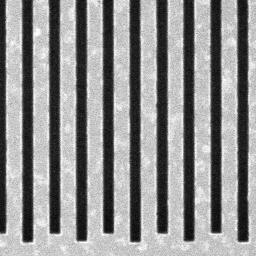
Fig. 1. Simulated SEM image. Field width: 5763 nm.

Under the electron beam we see parallel lines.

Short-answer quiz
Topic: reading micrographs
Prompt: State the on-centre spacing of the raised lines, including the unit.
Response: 606 nanometers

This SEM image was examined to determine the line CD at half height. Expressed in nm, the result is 394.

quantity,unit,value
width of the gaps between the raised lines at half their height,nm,217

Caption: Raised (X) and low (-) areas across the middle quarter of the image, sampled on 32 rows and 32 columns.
XXX---XXXX--XXXX---XXXX---XXXX--
XXX---XXXX--XXXX---XXXX---XXXX--
XXX---XXXX--XXXX---XXXX---XXXX--
XXX---XXXX--XXXX---XXXX---XXXX--
XXX---XXXX--XXXX---XXXX---XXXX--
XXX---XXXX--XXXX---XXXX---XXXX--
XXX---XXXX--XXXX---XXXX---XXXX--
XXX---XXXX--XXXX---XXXX---XXXX--
XXX---XXXX--XXXX---XXXX---XXXX--
XXX---XXXX--XXXX---XXXX---XXXX--
XXX---XXXX--XXXX---XXXX---XXXX--
XXX---XXXX--XXXX---XXXX---XXXX--
XXX---XXXX--XXXX---XXXX---XXXX--
XXX---XXXX--XXXX---XXXX---XXXX--
XXX---XXXX--XXXX---XXXX---XXXX--
XXX---XXXX--XXXX---XXXX---XXXX--
XXX---XXXX---XXX---XXXX---XXXX--
XXX---XXXX---XXX---XXXX---XXXX--
XXX---XXXX---XXX---XXXX---XXXX--
XXX---XXXX---XXX---XXXX---XXXX--
XXX---XXXX---XXX---XXXX---XXXX--
XXX---XXXX---XXX---XXXX---XXXX--
XXX---XXXX---XXX---XXXX---XXXX--
XXX---XXXX---XXX---XXXX---XXXX--
XXX---XXXX---XXX---XXXX---XXXX--
XXX---XXXX---XXX---XXXX---XXXX--
XXX---XXXX--XXXX---XXXX---XXXX--
XXX---XXXX--XXXX---XXXX---XXXX--
XXX---XXXX--XXXX---XXXX---XXXX--
XXX---XXXX--XXXX---XXXX---XXXX--
XXX---XXXX--XXXX---XXXX---XXXX--
XXX---XXXX--XXXX---XXXX---XXXX--